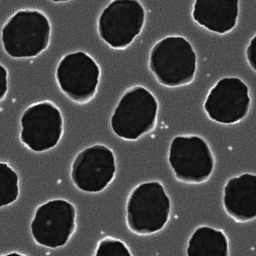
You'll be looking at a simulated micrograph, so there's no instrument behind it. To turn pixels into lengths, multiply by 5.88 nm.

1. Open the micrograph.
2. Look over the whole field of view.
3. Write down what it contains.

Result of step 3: a regular array of holes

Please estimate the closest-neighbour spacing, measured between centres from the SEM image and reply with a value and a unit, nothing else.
388 nanometers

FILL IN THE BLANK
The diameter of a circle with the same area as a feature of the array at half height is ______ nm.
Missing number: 261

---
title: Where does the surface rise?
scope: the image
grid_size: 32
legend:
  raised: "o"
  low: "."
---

oooooooooooooo...ooooooo......oo
oo.oooooooooo.....oooooo......oo
o.....ooooooo.....ooooooo.....oo
o.....oooooo......oooooooo...ooo
......ooooooo....ooooooooooooooo
......oooooooo..oooo....ooooooo.
o....oooooooooooooo.....ooooooo.
oooooooo....ooooooo.....ooooooo.
ooooooo.....ooooooo.....oooooooo
.oooooo.....oooooooo....oooooooo
.ooooooo....ooooooooo.ooooo...oo
.ooooooo....oooo...ooooooo.....o
ooooooooooooooo....ooooooo.....o
oooo...oooooooo.....oooooo.....o
ooo.....oooooo.....ooooooo.....o
ooo.....oooooo.....ooooooooooooo
ooo.....oooooo....oooooooooooooo
ooo....ooooooooooooooo...ooooooo
oooo..ooooo..oooooooo.....oooooo
oooooooooo....ooooooo.....oooooo
.oooooooo.....ooooooo......ooooo
..ooooooo.....oooooooo....oooooo
..ooooooo.....oooooooooo.oooo...
..oooooooo...oooo...oooooooo....
..ooooooooooooooo....ooooooo....
.ooooo...ooooooo.....ooooooo....
ooooo....ooooooo.....oooooooo...
oooo.....ooooooo.....ooooooooooo
oooo.....oooooooo...ooooo.oooooo
oooo.....ooooooooooooooo....oooo
ooooo...ooooo..ooooooooo....oooo
oooooooooooo....ooooooo.....oooo